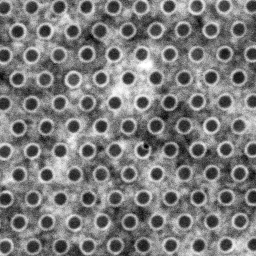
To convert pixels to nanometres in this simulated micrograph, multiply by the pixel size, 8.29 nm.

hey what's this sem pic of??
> a regular array of raised bodies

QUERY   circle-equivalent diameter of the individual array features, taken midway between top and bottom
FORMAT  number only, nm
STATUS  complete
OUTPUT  131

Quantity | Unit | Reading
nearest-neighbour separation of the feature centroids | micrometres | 0.226